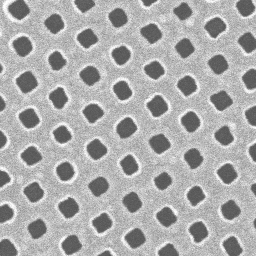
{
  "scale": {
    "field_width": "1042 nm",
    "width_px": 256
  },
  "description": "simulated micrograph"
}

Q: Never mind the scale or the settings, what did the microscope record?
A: a regular array of holes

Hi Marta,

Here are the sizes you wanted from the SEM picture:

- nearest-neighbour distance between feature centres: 147 nanometres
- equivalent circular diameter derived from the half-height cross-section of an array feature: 76.7 nanometres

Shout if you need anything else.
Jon